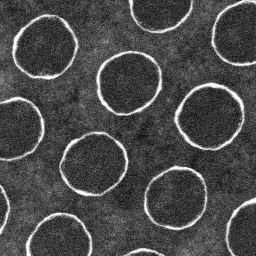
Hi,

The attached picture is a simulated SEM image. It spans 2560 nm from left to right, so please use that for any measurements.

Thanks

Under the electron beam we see raised bodies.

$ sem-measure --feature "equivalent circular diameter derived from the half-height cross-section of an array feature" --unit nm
632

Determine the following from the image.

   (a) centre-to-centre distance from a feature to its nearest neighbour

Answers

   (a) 0.885 µm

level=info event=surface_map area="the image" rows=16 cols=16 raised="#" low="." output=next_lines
........####..##
..##.....##..###
.####........###
.####..##.....##
..##..####......
......####..##..
##.....##..####.
###........####.
###..##.....###.
##..####........
....####...#....
....###..####...
.........####...
...#.....####..#
..###.........##
..####........##